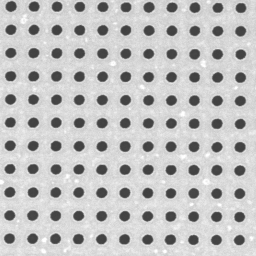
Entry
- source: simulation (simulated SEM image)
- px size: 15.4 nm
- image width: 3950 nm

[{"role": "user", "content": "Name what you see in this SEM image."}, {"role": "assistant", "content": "a regular array of holes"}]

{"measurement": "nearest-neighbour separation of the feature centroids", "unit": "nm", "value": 348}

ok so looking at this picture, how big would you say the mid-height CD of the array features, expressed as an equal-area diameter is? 169 nm